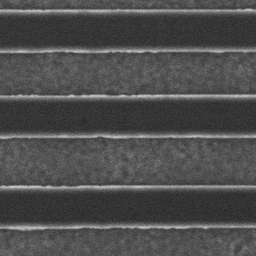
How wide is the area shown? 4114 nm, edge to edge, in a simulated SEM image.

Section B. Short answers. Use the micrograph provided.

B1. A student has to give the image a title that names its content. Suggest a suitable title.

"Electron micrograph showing lines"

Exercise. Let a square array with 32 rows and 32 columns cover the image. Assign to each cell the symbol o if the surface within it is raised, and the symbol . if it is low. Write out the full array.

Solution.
................................
oooooooooooooooooooooooooooooooo
oooooooooooooooooooooooooooooooo
oooooooooooooooooooooooooooooooo
oooooooooooooooooooooooooooooooo
oooooooooooooooooooooooooooooooo
................................
................................
................................
................................
................................
................................
oooooooooooooooooooooooooooooooo
oooooooooooooooooooooooooooooooo
oooooooooooooooooooooooooooooooo
oooooooooooooooooooooooooooooooo
oooooooooooooooooooooooooooooooo
................................
................................
................................
................................
................................
................................
oooooooooooooooooooooooooooooooo
oooooooooooooooooooooooooooooooo
oooooooooooooooooooooooooooooooo
oooooooooooooooooooooooooooooooo
oooooooooooooooooooooooooooooooo
................................
................................
................................
................................